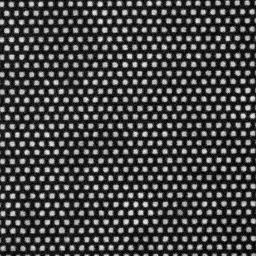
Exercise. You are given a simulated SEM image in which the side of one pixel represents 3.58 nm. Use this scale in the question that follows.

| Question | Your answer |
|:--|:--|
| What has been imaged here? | a regular array of raised bodies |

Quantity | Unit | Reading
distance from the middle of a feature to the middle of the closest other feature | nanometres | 34.3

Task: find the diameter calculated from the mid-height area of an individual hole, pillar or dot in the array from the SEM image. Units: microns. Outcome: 0.0171